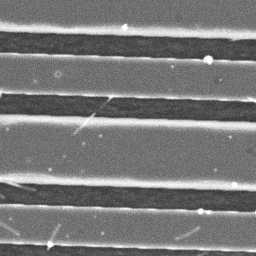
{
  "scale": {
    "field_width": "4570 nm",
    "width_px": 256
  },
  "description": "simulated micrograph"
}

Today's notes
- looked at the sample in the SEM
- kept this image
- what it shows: lines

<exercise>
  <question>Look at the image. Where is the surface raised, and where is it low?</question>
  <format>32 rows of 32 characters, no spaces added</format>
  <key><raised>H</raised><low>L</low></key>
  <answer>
HHHHHHHHHHHHHHHHHHHHHHHHHHHHHHHH
HHHHHHHHHHHHHHHHHHHHHHHHHHHHHHHH
HHHHHHHHHHHHHHHHHHHHHHHHHHHHHHHH
HHHHHHHHHHHHHHHHHHHHHHHHHHHHHHHH
LLLLLLLLLLLLLLLLLLLLLLLLLLLLHHHH
LLLLLLLLLLLLLLLLLLLLLLLLLLLLLLLL
LLLLLLLLLLLLLLLLLLLLLLLLLLLLLLLL
HHHHHHHHHHHHHHHHHHHHHHHHHHHLLLLL
HHHHHHHHHHHHHHHHHHHHHHHHHHHHHHHH
HHHHHHHHHHHHHHHHHHHHHHHHHHHHHHHH
HHHHHHHHHHHHHHHHHHHHHHHHHHHHHHHH
HHHHHHHHHHHHHHHHHHHHHHHHHHHHHHHH
LLLLLLLLLLLLLLLLLLLLLLLLLLLHHHHH
LLLLLLLLLLLLLLLLLLLLLLLLLLLLLLLL
LLLLLLLLLLLLLLLLLLLLLLLLLLLLLLLL
HHHHHHHHHHHHHHHHHHHHHHHHHHHHHHHL
HHHHHHHHHHHHHHHHHHHHHHHHHHHHHHHH
HHHHHHHHHHHHHHHHHHHHHHHHHHHHHHHH
HHHHHHHHHHHHHHHHHHHHHHHHHHHHHHHH
HHHHHHHHHHHHHHHHHHHHHHHHHHHHHHHH
HHHHHHHHHHHHHHHHHHHHHHHHHHHHHHHH
HHHHHHHHHHHHHHHHHHHHHHHHHHHHHHHH
HHHHHHHHHHHHHHHHHHHHHHHHHHHHHHHH
LLLLLLLLLLLLLLLLLLLLLLLLLLLHHHHH
LLLLLLLLLLLLLLLLLLLLLLLLLLLLLLLL
LLLLLLLLLLLLLLLLLLLLLLLLLLLLLLLL
HHHHHHHHHHHHHHHHHHHHHHHHHHHHHHLL
HHHHHHHHHHHHHHHHHHHHHHHHHHHHHHHH
HHHHHHHHHHHHHHHHHHHHHHHHHHHHHHHH
HHHHHHHHHHHHHHHHHHHHHHHHHHHHHHHH
LLLLHHHHHHHHHHHHHHHHHHHHHHHHHHHH
LLLLLLLLLLLLLLLLLLLLLLLLLLLLLLLL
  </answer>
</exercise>